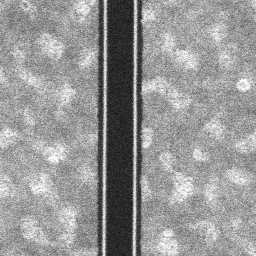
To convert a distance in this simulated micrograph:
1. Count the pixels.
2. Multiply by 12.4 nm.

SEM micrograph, one or a few lines or trenches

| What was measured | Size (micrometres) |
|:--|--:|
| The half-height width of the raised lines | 0.387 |